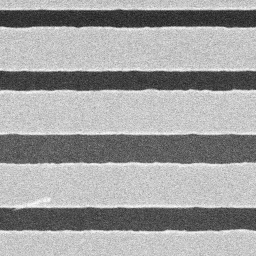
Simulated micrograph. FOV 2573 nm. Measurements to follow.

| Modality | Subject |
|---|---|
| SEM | lines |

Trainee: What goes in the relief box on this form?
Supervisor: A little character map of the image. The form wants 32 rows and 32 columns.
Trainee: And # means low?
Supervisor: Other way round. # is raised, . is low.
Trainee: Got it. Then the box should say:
################################
................................
................................
#..###########....############.#
################################
################################
################################
################################
################################
................................
................................
################################
################################
################################
################################
################################
################################
................................
................................
................................
##.####################.##..####
################################
################################
################################
################################
################################
................................
................................
................................
################################
################################
################################